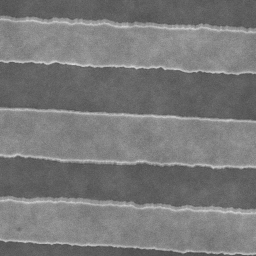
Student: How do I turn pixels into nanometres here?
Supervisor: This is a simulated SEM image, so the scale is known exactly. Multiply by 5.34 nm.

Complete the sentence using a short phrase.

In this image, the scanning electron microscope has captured lines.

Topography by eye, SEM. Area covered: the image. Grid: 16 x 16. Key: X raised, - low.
----------------
XXXXXXX---------
XXXXXXXXXXXXXXXX
XXXXXXXXXXXXXXXX
-------------XXX
----------------
----------------
XXXXXXXXXXXXXX--
XXXXXXXXXXXXXXXX
XXXXXXXXXXXXXXXX
----------------
----------------
X---------------
XXXXXXXXXXXXXXXX
XXXXXXXXXXXXXXXX
---------XXXXXXX